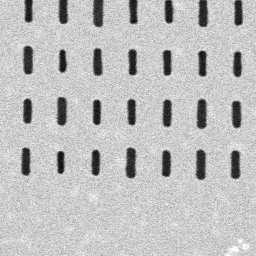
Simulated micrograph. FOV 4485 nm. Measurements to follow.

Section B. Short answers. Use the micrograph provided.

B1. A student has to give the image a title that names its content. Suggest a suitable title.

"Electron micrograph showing a regular array of holes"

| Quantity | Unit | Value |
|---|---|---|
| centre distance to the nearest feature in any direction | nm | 607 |